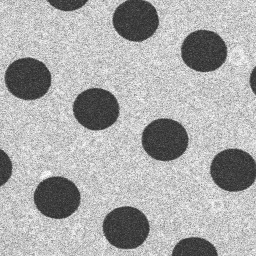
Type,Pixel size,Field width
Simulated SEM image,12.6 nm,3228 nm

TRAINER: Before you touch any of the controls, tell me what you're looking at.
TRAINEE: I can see holes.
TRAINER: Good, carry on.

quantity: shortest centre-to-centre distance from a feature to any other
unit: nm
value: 948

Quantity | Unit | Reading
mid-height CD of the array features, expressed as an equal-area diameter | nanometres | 565